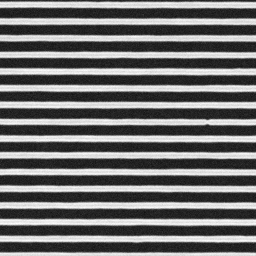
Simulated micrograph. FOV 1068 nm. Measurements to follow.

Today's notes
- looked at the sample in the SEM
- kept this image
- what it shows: parallel lines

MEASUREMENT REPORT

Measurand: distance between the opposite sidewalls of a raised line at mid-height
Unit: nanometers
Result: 21.9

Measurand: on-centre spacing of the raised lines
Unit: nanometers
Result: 69.7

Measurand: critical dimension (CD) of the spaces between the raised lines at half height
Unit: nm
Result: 47.5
